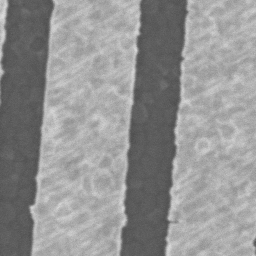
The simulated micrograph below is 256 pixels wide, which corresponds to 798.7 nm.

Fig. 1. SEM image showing one or a few lines or trenches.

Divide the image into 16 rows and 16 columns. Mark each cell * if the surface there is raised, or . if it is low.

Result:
...******...****
...******...****
...******...****
...*****...*****
...*****...*****
...*****...*****
...*****...*****
...*****...*****
...*****...*****
...*****...*****
..******...*****
..******...*****
..******...*****
..******...*****
..******...*****
..*****....*****